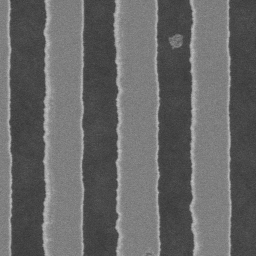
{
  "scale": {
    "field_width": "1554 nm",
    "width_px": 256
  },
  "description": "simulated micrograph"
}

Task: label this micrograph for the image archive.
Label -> lines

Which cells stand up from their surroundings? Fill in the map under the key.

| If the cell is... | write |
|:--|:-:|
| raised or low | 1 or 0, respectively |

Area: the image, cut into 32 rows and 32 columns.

10000011110000111111000011111000
10000011110000111111000011111000
10000011110000111111000011111000
10000011110000111111000011111000
10000011110000111111000011111000
10000011110000111111000011111000
10000011110000011111000011111000
10000011110000111111000011111000
10000011110000011111000011111000
10000011110000011111000011111000
10000011110000011111000011111000
10000011110000011111000011111000
10000011110000011111000011111000
10000011110000011111000011111000
10000011110000011111000011111000
10000011110000011111000011111000
10000011110000011111000011111000
10000011110000011111000011111000
10000011110000011111000011111000
10000011110000011111000011111000
10000011110000011111000011111000
10000011110000011111000011111000
10000011110000011111000011111000
10000011111000011111000011111000
10000011110000011111000011111000
10000011110000011111000011111000
10000011110000011111000011111000
10000111110000011111000011111000
10000111110000011111000011111000
10000111110000011111000011111000
10000011110000011111000011111000
10000011110000011111000011111000